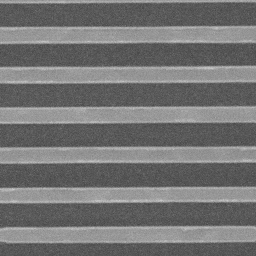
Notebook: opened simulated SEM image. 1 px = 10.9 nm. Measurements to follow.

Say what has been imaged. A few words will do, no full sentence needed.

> parallel lines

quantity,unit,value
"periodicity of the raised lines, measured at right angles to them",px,40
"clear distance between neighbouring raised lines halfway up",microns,0.276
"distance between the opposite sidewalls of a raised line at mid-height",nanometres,156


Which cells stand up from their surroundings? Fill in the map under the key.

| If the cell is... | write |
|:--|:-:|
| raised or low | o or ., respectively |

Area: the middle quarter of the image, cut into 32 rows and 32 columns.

................................
oooooooooooooooooooooooooooooooo
oooooooooooooooooooooooooooooooo
oooooooooooooooooooooooooooooooo
ooooooooooo.....................
................................
................................
................................
................................
................................
................................
oooooooooooooooooooooooooooooooo
oooooooooooooooooooooooooooooooo
oooooooooooooooooooooooooooooooo
oo......ooo.....................
................................
................................
................................
................................
................................
................................
oooooooooooooooooooooooooooooooo
oooooooooooooooooooooooooooooooo
oooooooooooooooooooooooooooooooo
................................
................................
................................
................................
................................
................................
................................
oooooooooooooooooooooooooooooooo